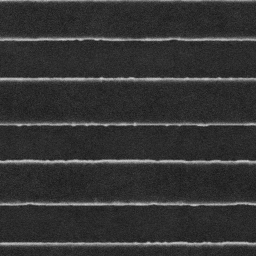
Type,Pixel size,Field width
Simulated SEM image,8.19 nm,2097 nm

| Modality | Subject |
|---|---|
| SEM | lines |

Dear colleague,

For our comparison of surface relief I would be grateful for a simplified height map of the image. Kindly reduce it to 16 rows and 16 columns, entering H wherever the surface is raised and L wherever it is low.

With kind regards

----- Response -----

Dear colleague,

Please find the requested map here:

HHHHHHHHHHHHHHHH
HHHHHHHHHHHHHHHH
LLLLLLLLLLLLLLLL
LLLLLLLLLLLLLLLL
LLLLLLLLLLLLLLLL
HHHHHHHHHHHHHHHH
HHHHHHHHHHHHHHHH
HHHHHHHHHHHHHHHH
LLLLLLLLLLLLLLLL
LLLLLLLLLLLLLLLL
HHHHHHHHHHHHHHHH
HHHHHHHHHHHHHHHH
HHHHHHHHHHHHHHHH
LLLLLLLLLLLLLLLL
LLLLLLLLLLLLLLLL
HHHHHHHHHHHHHHHH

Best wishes